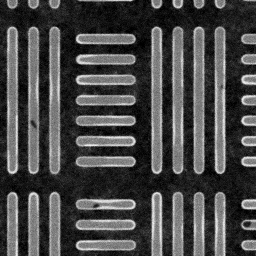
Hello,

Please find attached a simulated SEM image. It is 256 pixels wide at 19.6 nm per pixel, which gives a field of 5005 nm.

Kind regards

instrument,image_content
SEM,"groups of lines, slits or small figures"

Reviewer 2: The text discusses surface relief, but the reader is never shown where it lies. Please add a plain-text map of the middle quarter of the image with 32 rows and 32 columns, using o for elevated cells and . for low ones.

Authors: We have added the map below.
......................oo...ooo..
......................oo...ooo..
......................oo...ooo..
....oooooooooooooo....oo...ooo..
...ooooooooooooooo....oo...ooo..
......................oo...ooo..
......................oo...ooo..
......................oo...ooo..
...oooooooooooooo.....oo...ooo..
...ooooooooooooooo....oo...ooo..
......................oo...ooo..
......................oo...ooo..
......................oo...ooo..
...oooooooooooooo.....oo...ooo..
...ooooooooooooooo....oo...ooo..
......................oo....o...
......................oo....o...
......................oo....oo..
...oooooooooooooo.....oo...ooo..
...oooooooooooooo.....oo...ooo..
......................oo...ooo..
......................oo...ooo..
......................oo...ooo..
....ooooooooooooo.....oo...ooo..
...ooooooooooooooo....oo...ooo..
....ooooo.............oo...ooo..
......................oo...ooo..
................................
................................
................................
................................
................................